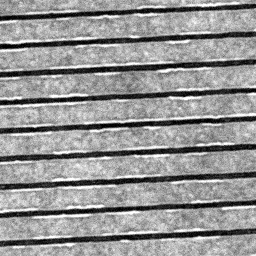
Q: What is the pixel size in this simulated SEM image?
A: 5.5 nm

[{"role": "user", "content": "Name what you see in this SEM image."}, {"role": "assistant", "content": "parallel lines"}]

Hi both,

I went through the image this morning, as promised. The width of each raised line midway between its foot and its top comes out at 0.12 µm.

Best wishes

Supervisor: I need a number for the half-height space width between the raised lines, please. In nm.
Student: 33.7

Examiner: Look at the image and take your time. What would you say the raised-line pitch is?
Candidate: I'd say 155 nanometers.